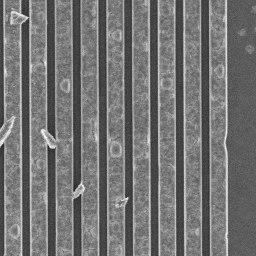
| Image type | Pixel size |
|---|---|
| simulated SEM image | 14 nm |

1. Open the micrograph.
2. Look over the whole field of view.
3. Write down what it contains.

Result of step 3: parallel lines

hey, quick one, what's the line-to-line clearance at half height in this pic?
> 121 nm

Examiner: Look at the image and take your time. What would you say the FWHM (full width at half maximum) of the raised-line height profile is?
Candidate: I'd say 242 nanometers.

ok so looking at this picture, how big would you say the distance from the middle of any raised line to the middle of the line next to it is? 0.36 um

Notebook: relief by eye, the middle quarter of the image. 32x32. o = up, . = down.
oo..oooo...oooo..oooo...oooo..oo
oo..oooo...oooo..oooo...oooo..oo
oo..oooo...oooo..oooo...oooo..oo
oo..oooo...oooo..oooo...oooo..oo
oo..oooo...oooo..oooo...oooo..oo
oo..oooo...oooo..oooo...oooo..oo
oo..oooo...oooo..oooo...oooo..oo
oo..oooo...oooo..oooo...oooo..oo
oo..oooo...oooo..oooo...oooo..oo
oo..oooo...oooo..oooo...oooo..oo
oo..oooo...oooo..oooo...oooo..oo
oo..ooooo..oooo..oooo...oooo..oo
oo..ooooo..oooo..oooo...oooo..oo
oo...ooo...oooo..oooo...oooo..oo
oo..oooo...oooo..oooo...oooo..oo
oo..oooo...oooo..oooo...oooo..oo
oo..oooo...oooo..oooo...oooo..oo
oo..oooo...oooo..oooo...oooo..oo
oo..oooo...oooo..oooo...oooo..oo
oo..oooo...oooo..oooo...oooo..oo
oo..oooo...oooo..oooo...oooo..oo
oo..oooo...oooo..oooo...oooo..oo
oo..oooo...oooo..oooo...oooo..oo
oo..oooo...oooo..oooo...oooo..oo
oo..oooo...oooo..oooo...oooo..oo
oo..oooo...oooo..oooo...oooo..oo
oo..oooo...oooo..oooo...oooo..oo
oo..oooo...oooo..oooo...oooo..oo
oo..oooo...oooo..oooo...oooo..oo
oo..oooo...oooo..oooo...oooo..oo
oo..oooo...oooo..oooo...oooo..oo
oo.ooooo...oooo..oooo...oooo..oo